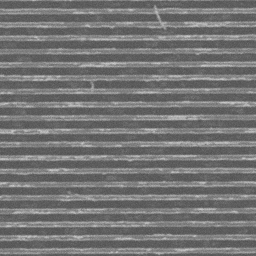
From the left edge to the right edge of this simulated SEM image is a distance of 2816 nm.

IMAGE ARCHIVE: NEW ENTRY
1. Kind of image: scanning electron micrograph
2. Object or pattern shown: parallel lines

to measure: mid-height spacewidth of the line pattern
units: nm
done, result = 94.9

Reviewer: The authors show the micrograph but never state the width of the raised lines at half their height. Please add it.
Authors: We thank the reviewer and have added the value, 48.1 nanometres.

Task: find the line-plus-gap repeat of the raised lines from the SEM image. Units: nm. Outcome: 146